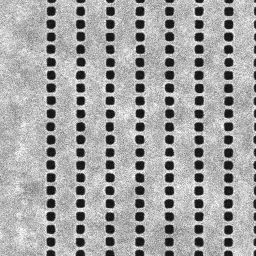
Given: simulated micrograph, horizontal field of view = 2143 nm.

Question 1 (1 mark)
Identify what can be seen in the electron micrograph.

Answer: a regular array of holes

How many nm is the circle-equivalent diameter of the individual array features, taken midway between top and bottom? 81.2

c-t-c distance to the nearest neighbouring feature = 106 nanometers